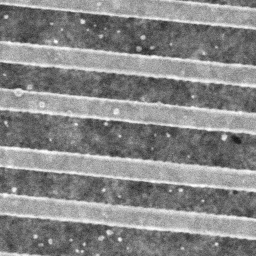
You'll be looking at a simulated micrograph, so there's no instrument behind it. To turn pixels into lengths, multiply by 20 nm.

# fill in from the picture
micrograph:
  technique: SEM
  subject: lines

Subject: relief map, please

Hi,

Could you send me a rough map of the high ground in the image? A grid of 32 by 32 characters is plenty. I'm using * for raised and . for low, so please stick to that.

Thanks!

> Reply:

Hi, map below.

.*************************......
..........**********************
.....................***********
..............................**
................................
***.............................
*************...................
***********************.........
.........***********************
...................*************
.............................***
****............................
**************..................
************************........
..........**********************
...................*************
..............................**
................................
*...............................
************....................
*********************...........
........**********************..
.................***************
...........................*****
**..............................
************....................
**********************..........
.........***********************
..................**************
.............................***
................................
................................